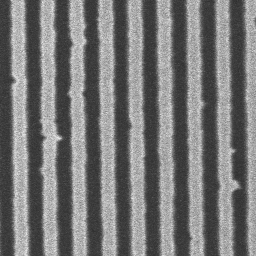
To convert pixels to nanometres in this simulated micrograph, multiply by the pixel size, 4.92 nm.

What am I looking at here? parallel lines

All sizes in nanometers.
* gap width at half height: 73.8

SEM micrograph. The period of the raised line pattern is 0.144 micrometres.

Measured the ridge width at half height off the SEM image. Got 69.5 nanometers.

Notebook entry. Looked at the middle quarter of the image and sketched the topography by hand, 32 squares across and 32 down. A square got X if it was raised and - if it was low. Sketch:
--XXX----XXXX---XXXX---XXXX----X
--XXX----XXX----XXXX----XXX----X
--XXX----XXX----XXX-----XXX----X
--XXX----XXX----XXXX----XXX----X
--XXX----XXX----XXXX----XXX----X
--XXX----XXX----XXXX----XXX----X
-XXXX----XXX----XXXX----XXX----X
-XXXX----XXX----XXX-----XXX----X
--XXX----XXXX---XXXX---XXXX----X
--XXX----XXX----XXXX----XXX----X
--XXX----XXX----XXXX----XXX----X
--XXX----XXX----XXXX----XXX----X
--XXX----XXX----XXXX----XXX----X
--XXX----XXX----XXXX----XXX----X
--XXX----XXXX----XXX----XXX----X
--XXX----XXXX----XXX----XXX----X
--XXX----XXX-----XXX----XXX----X
--XXX----XXXX---XXXX----XXX----X
--XXX----XXX----XXXX----XXX----X
--XXX----XXXX---XXXX----XXX----X
--XXX----XXXX---XXXX----XXX----X
--XXX----XXXX---XXXX---XXXX----X
--XXX----XXXX---XXXX----XXX----X
--XXXX---XXXX---XXXX----XXX----X
--XXX----XXXX---XXXX----XXX----X
--XXX----XXXX----XXX----XXX----X
--XXX----XXXX---XXXX----XXX----X
--XXX----XXXX---XXXX----XXX----X
--XXX----XXXX----XXX----XXX----X
--XXX----XXXX----XXX----XXXX---X
--XXXX---XXXX----XXX----XXXX---X
--XXXX---XXXX----XXX----XXX----X